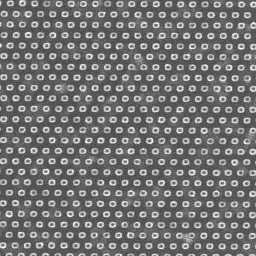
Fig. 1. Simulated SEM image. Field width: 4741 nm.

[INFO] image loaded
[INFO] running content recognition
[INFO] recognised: a regular array of raised bodies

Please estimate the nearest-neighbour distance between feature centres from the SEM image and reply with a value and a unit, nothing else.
220 nanometers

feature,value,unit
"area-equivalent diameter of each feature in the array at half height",111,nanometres